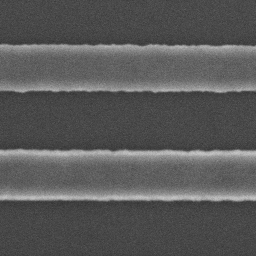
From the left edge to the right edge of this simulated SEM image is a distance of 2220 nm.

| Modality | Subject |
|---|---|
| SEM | lines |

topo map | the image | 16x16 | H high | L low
LLLLLLLLLLLLLLLL
LLLLLLLLLLLLLLLL
LLLLLLLLLLLLLLLL
HHHHHHHHHHHHHHHH
HHHHHHHHHHHHHHHH
HHHHHHHHHHHHHHHH
LLLLLLLLLLLLLLLL
LLLLLLLLLLLLLLLL
LLLLLLLLLLLLLLLL
HHHHHHHHHHHHHHHH
HHHHHHHHHHHHHHHH
HHHHHHHHHHHHHHHH
LLLLLLLLLLLLLLLL
LLLLLLLLLLLLLLLL
LLLLLLLLLLLLLLLL
LLLLLLLLLLLLLLLL